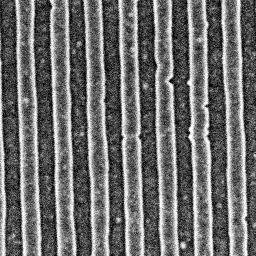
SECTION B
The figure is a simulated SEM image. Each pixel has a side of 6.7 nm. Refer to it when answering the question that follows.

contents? parallel lines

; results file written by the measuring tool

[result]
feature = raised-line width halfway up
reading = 114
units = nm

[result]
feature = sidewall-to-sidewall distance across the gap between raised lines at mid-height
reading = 0.114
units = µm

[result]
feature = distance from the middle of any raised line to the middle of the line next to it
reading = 231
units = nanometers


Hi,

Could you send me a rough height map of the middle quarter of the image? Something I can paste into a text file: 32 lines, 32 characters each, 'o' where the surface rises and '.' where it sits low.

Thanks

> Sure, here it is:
o.....oooo....oooo......ooo.....
o.....oooo....oooo.....oooo.....
o.....oooo....oooo.....oooo.....
o.....oooo....oooo.....oooo.....
o.....oooo.....oooo....ooo.....o
o.....oooo.....oooo....oooo.....
o.....oooo.....oooo....oooo.....
o.....oooo....ooooo....oooo.....
oo....oooo....ooooo....oooo.....
oo....oooo....ooooo....oooo.....
oo....oooo.....oooo....oooo.....
oo....oooo.....oooo....oooo.....
o.....oooo.....oooo....oooo.....
o.....oooo.....oooo....oooo.....
o.....oooo.....oooo....oooo.....
o.....oooo.....oooo....ooooo....
oo....oooo.....oooo....ooooo...o
oo....oooo.....oooo....ooooo....
oo....oooo.....oooo....ooooo...o
oo....ooooo....oooo....ooooo....
oo....ooooo....oooo....ooooo....
oo....ooooo....oooo....ooooo....
oo....ooooo....oooo.....oooo....
oo....ooooo....oooo.....oooo....
oo....ooooo....oooo.....oooo....
oo....ooooo....oooo.....oooo....
oo.....oooo....oooo.....oooo....
oo.....oooo....oooo.....oooo....
oo.....oooo....oooo.....oooo....
oo.....oooo....oooo.....oooo....
oo.....oooo....oooo.....oooo....
oo.....oooo....oooo.....oooo....